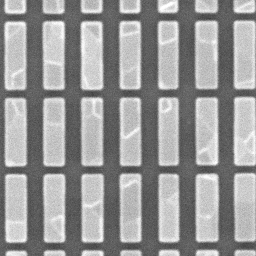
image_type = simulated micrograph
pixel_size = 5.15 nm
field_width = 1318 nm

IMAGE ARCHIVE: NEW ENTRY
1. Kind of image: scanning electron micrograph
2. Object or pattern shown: wiring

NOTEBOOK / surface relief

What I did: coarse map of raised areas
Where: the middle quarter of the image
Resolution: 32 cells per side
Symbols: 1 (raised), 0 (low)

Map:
00000111110000111110000011110000
00001111110000111110000011110000
00001111110000111110000011110000
00001111110000111110000011110000
00001111110000111110000011110000
00001111110000111110000011110000
00000000000000000000000000000000
00000000000000000000000000000000
00000000000000000000000000000000
00001111110000111110000011110000
00001111110000111110000011110000
00001111110000111110000011110000
00000111110000111110000011110000
00000111110000111110000011110000
00000111110000111110000011110000
00000111110000111110000011110000
00000111110000111110000011110000
00000111110000111110000011110000
00000111110000111110000011110000
00000111110000111110000011110000
00000111110000111110000011110000
00000111110000111110000011110000
00000111110000111110000011110000
00000111110000111110000011110000
00000111110000111110000011110000
00000000000000000000000000000000
00000000000000000000000000000000
00000000000000000000000000000000
00000111110000111110000011110000
00000111110000111110000011110000
00000111110000111110000011110000
00000111110000111110000011110000